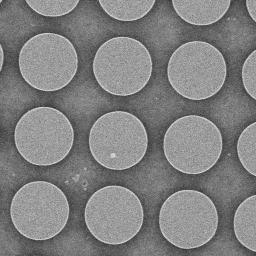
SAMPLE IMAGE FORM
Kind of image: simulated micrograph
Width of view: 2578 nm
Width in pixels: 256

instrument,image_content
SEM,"an array of small figures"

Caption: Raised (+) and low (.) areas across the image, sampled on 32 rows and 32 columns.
....++++++...++++++...+++++++..+
.....++++....+++++....++++++...+
...............++......++++.....
................................
....++++........................
...++++++....+++++.....+++......
...++++++...+++++++...+++++.....
..++++++++..+++++++..+++++++...+
..++++++++..+++++++..+++++++..++
...++++++...+++++++..+++++++..++
....++++....++++++...+++++++..++
..............+++.....+++++....+
................................
.....+..........................
...+++++.....++++......++.......
..+++++++...++++++....+++++.....
..+++++++..+++++++...++++++...++
..+++++++..+++++++...+++++++..++
..+++++++..+++++++...+++++++..++
...+++++....++++++...++++++...++
....+++......++++....++++++...++
.......................++......+
................................
...++++......+++................
..++++++....+++++....+++++......
.+++++++...+++++++..+++++++...++
.++++++++..+++++++..+++++++..+++
..++++++...+++++++..+++++++..+++
..++++++...+++++++..+++++++..+++
...++++.....+++++....++++++...++
..............+.......+++.....++
................................